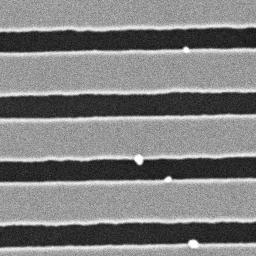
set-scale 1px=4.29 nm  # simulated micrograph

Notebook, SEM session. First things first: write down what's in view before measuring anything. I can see lines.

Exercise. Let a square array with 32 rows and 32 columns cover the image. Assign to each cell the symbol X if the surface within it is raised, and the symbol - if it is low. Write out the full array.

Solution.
XXXXXXXXXXXXXXXXXXXXXXXXXXXXXXXX
XXXXXXXXXXXXXXXXXXXXXXXXXXXXXXXX
XXXXXXXXXXXXXXXXXXXXXXXXXXXXXXXX
XXXXXXXXXXXXXXXXXXXXXXXX-X------
--------------------------------
--------------------------------
------XXXXXXXXXXXXXXXXXXXXXXXXXX
XXXXXXXXXXXXXXXXXXXXXXXXXXXXXXXX
XXXXXXXXXXXXXXXXXXXXXXXXXXXXXXXX
XXXXXXXXXXXXXXXXXXXXXXXXXXXXXXXX
XXXXXXXXXXXXXXXXXXXXXXXXXXXXXXXX
XXXXXXXXXXXXXXXXXXXXXX---XXX----
--------------------------------
--------------------------------
---------------------X-XXXXXXXXX
XXXXXXXXXXXXXXXXXXXXXXXXXXXXXXXX
XXXXXXXXXXXXXXXXXXXXXXXXXXXXXXXX
XXXXXXXXXXXXXXXXXXXXXXXXXXXXXXXX
XXXXXXXXXXXXXXXXXXXXXXXXXXXXXXXX
XXXXXXXXXXXXXXXXXXXXXXXXXXXXXXXX
--------------------------------
--------------------------------
--------------------XXXXXXXXXXXX
XXXXXXXXXXXXXXXXXXXXXXXXXXXXXXXX
XXXXXXXXXXXXXXXXXXXXXXXXXXXXXXXX
XXXXXXXXXXXXXXXXXXXXXXXXXXXXXXXX
XXXXXXXXXXXXXXXXXXXXXXXXXXXXXXXX
XXXXXXXXXXXXXXXXXXXXXXXXXXXXXXXX
--------------------------------
--------------------------------
----------------------XXXXXXXXXX
XXXXXXXXXXXXXXXXXXXXXXXXXXXXXXXX